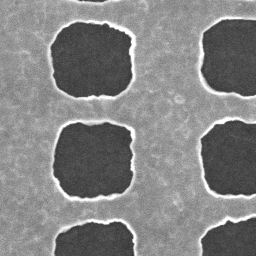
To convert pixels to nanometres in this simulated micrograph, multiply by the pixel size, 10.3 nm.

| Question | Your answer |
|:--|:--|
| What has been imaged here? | holes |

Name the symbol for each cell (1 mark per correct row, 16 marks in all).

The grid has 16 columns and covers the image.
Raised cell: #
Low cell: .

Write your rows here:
################
#####..######...
###.....#####...
###.....#####...
###.....#####...
####....#####...
################
################
####....#####...
###.....#####...
###.....#####...
####....#####...
################
################
####....#####...
###.....#####...